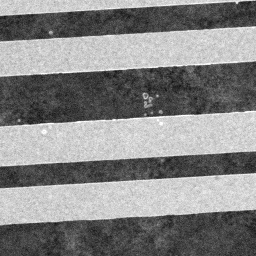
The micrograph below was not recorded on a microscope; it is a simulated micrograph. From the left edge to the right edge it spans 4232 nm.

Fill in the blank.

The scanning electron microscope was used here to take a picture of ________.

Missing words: one or a few lines or trenches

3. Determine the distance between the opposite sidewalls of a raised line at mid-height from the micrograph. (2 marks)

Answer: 598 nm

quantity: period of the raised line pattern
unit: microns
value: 1.22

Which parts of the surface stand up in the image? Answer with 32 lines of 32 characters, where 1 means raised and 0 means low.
11111111111111111111111000000000
11111100000000000000000000000000
00000000000000000000000000000000
00000000000000000000000000000011
00000000000001111111111111111111
11111111111111111111111111111111
11111111111111111111111111111111
11111111111111111111111111111111
11111111111111111000000000000000
00000000000000000000000000000000
00000000000000000000000000000000
00000000000000000000000000000000
00000000000000000000000000000000
00000000000000000000000000000000
00000000000000000000001111111111
00000111111111111111111111111111
11111111111111111111111111111111
11111111111111111111111111111111
11111111111111111111111111111111
11111111111111111111100000000000
11110000000000000000000000000000
00000000000000000000000000000000
00000000000000000001111111111111
00111111111111111111111111111111
11111111111111111111111111111111
11111111111111111111111111111111
11111111111111111111111111000000
11111111100000000000000000000000
00000000000000000000000000000000
00000000000000000000000000000000
00000000000000000000000000000000
00000000000000000000000000000000